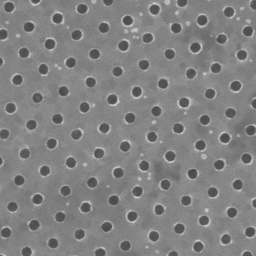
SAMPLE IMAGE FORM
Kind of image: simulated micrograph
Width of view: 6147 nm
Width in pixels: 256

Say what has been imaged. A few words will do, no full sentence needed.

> a regular array of holes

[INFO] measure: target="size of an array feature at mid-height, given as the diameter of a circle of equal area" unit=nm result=258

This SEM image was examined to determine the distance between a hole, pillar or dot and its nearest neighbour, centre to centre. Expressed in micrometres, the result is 0.626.